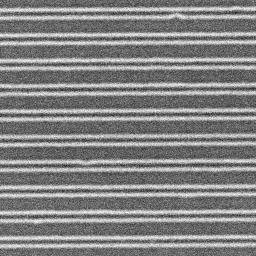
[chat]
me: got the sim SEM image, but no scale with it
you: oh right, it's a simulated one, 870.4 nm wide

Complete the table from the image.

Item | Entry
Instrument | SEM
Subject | parallel lines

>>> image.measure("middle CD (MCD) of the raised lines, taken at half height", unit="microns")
0.0306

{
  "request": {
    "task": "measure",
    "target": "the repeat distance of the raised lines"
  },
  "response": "86.2 nanometres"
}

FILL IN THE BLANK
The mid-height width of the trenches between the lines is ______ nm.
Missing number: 55.2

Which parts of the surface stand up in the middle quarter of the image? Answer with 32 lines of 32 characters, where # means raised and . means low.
################################
................................
................................
................................
................................
....############################
################################
####............................
................................
................................
................................
................................
################################
################################
................................
................................
................................
................................
################################
################################
................................
................................
................................
................................
####..##########################
################################
................................
................................
................................
................................
................................
################################